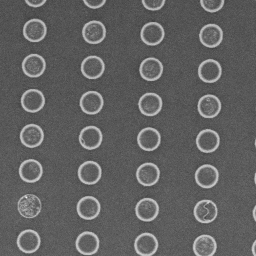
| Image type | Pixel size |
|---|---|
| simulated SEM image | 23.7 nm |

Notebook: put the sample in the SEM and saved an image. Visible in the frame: a regular array of raised bodies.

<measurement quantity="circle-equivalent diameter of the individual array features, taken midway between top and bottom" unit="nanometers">510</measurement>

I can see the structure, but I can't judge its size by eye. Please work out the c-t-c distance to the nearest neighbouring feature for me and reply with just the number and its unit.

0.832 micrometres